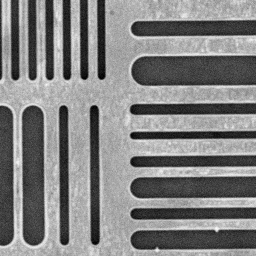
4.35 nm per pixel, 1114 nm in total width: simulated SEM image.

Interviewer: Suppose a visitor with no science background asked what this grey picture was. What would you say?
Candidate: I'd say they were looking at groups of lines, slits or small figures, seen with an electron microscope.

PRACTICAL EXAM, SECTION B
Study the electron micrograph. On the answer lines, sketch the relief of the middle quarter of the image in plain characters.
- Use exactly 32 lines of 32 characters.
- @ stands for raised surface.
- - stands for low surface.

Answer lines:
--@@--@@---@@@@@@---------------
--@@--@@---@@@@@----------------
--@@--@@---@@@@@@---------------
--@@--@@@-@@@@@@@---------------
@@@@@@@@@@@@@@@@@@--------------
@@@@@@@@@@@@@@@@@@@@------------
@@@@@@@@@@@@@@@@@@@@@@@@@@@@@@@@
@@@@@@@@@@@@@@@@@@@@@@@@@@@@@@@@
@@@@@@@@@@@@@@@@@@@@@@@@@@@@@@@@
@@@@@@@@@@@@@@@@@@@@@@@@@@@@@@@@
@@@@@@@-@@@@@@@@@---------------
-@@@@@---@@@@@@@----------------
-@@@@@---@@@@@@@@---------------
-@@@@@---@@@@@@@@@@@@@@@@@@@@@@@
-@@@@@---@@@@@@@@@@@@@@@@@@@@@@@
-@@@@@---@@@@@@@@@@@@@@@@@@@@@@@
-@@@@@---@@@@@@@@@@@@@@@@@@@@@@@
-@@@@@---@@@@@@@@---------------
-@@@@@---@@@@@@@@---------------
-@@@@@---@@@@@@@@@@@@@@@@@@@@@@@
-@@@@@---@@@@@@@@@@@@@@@@@@@@@@@
-@@@@@---@@@@@@@@@@@@@@@@@@@@@@@
-@@@@@---@@@@@@@@@@@@@@@@@@@@@@@
-@@@@@---@@@@@@@@---------------
-@@@@@---@@@@@@@----------------
-@@@@@---@@@@@@@@---------------
-@@@@@---@@@@@@@@@@@@@@@@@@@@@@@
-@@@@@---@@@@@@@@@@@@@@@@@@@@@@@
-@@@@@---@@@@@@@@@--------------
-@@@@@---@@@@@@@@---------------
-@@@@@---@@@@@@@----------------
-@@@@@---@@@@@@@----------------